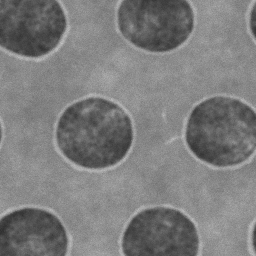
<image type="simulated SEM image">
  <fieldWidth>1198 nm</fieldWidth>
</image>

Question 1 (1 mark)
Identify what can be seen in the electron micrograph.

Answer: holes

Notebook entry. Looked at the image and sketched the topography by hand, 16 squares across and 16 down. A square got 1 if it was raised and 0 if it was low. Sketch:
0000111000001111
0000111000001111
0000111100001111
1001111111111111
1111111111111111
1111111111111111
1111100111110001
1111000011110000
1110000011110000
1111000011110000
1111100111111111
1111111111111111
1111111111111111
0001111100001111
0000111100001111
0000111100001111